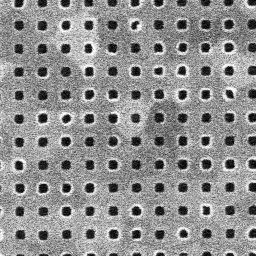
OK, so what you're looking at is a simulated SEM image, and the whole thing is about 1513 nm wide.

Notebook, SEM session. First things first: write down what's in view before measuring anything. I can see a regular array of holes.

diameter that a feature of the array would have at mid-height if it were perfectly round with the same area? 60.7 nm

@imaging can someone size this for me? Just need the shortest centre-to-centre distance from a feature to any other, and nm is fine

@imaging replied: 136